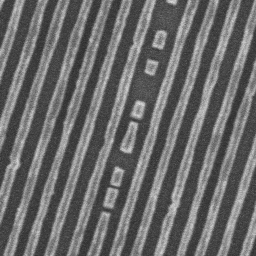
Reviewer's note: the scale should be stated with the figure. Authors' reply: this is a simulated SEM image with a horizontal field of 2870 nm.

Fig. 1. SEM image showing parallel lines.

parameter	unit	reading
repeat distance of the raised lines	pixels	20.5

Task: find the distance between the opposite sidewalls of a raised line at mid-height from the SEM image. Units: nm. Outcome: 87.1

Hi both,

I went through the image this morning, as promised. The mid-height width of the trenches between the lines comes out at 0.145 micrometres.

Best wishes